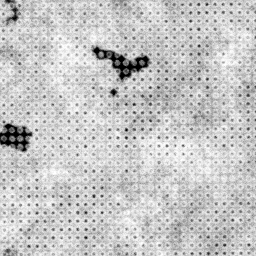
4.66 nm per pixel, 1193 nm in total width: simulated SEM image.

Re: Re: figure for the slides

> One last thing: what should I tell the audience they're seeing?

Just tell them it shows a regular array of holes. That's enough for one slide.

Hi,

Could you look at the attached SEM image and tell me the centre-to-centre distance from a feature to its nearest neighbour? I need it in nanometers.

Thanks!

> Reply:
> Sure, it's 37.2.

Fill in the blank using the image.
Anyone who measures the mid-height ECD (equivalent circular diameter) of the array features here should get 18.9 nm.